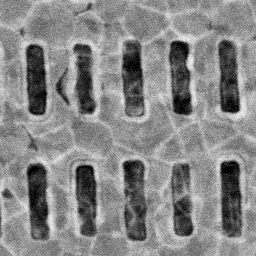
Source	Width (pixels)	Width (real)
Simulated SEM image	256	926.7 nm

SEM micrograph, a regular array of holes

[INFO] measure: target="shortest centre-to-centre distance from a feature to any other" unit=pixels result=48